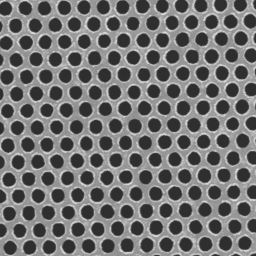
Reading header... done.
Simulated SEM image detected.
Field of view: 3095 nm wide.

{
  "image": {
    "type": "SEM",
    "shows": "a regular array of holes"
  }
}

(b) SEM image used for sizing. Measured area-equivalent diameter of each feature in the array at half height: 164 nm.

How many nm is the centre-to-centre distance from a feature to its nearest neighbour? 233